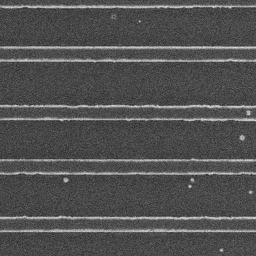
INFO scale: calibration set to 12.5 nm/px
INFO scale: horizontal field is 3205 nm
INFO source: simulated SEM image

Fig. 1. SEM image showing lines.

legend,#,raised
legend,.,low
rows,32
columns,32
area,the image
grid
################################
................................
................................
................................
................................
................................
################################
################################
................................
................................
................................
................................
................................
################################
################################
................................
................................
................................
................................
................................
################################
################################
................................
................................
................................
................................
................................
################################
################################
................................
................................
................................